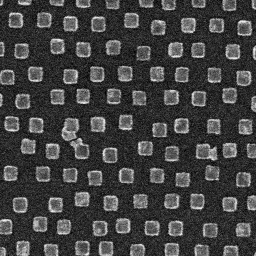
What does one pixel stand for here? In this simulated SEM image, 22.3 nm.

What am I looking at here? a regular array of raised bodies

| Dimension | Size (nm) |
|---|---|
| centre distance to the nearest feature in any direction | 563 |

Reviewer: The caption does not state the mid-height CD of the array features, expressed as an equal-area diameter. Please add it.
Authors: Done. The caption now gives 326 nanometers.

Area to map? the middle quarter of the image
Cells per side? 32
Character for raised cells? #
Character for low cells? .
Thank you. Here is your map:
................................
#......###....###.....###...###.
###....###....###.....###...###.
###....###....###.....###...###.
###.............................
................................
....##.....##...................
...###.....###...###.....###....
...###.....###...###.....###....
.....#.....###...###.....###....
................................
................................
................................
..............###...............
###....###....###...........###.
###....###....###.....###...###.
###....###............###...###.
###...................###.......
.#..............................
..##............................
..####.............###..........
...###....###......###....##....
...###....###......###....##....
.....#....###.............###...
...........##...................
................................
###...........###.....###.......
###...###.....###.....###...###.
###...###.....###.....###...###.
......###......##......##...###.
................................
................................